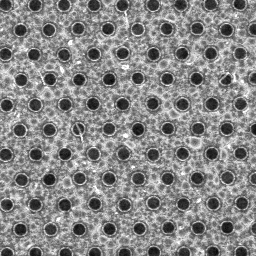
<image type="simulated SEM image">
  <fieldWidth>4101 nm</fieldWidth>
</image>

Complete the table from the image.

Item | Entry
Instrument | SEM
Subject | a regular array of raised bodies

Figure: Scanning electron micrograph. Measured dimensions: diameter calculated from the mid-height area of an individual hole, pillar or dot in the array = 205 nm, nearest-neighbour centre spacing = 451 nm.